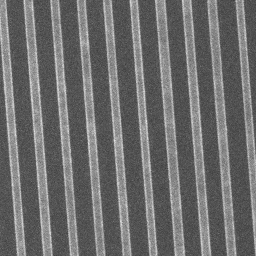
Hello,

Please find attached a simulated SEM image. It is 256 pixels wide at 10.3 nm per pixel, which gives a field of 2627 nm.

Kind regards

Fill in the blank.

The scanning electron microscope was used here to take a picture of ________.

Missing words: parallel lines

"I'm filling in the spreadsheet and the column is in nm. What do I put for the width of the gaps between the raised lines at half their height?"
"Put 190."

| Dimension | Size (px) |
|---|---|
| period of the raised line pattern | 26.3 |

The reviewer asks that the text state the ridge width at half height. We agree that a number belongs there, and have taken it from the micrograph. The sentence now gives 8.11 px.